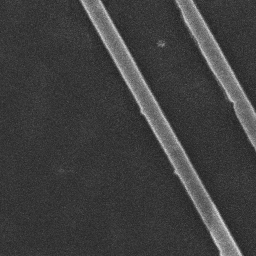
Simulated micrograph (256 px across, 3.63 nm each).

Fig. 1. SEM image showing one or a few lines or trenches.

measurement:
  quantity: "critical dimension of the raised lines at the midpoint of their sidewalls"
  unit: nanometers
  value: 56.9